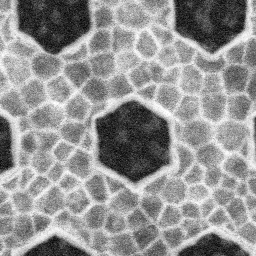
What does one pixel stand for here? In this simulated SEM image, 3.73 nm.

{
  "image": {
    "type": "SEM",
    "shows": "holes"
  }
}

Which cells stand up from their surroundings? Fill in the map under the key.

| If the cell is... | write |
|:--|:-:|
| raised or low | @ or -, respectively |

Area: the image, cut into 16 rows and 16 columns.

@-----@@@@@-----
@-----@@@@@----@
@@---@@@@@@@---@
@@@@@@@@@@@@@@@@
@@@@@@@@@@@@@@@@
@@@@@@@@@@@@@@@@
@@@@@@@--@@@@@@@
-@@@@@-----@@@@@
-@@@@@-----@@@@@
-@@@@@-----@@@@@
-@@@@@----@@@@@@
@@@@@@@@-@@@@@@@
@@@@@@@@@@@@@@@@
@@@@@@@@@@@@@@@@
@@@@@@@@@@@@@-@@
@----@@@@@@----@